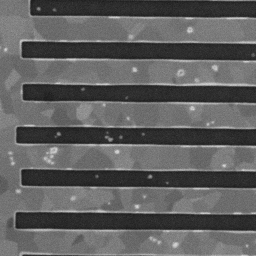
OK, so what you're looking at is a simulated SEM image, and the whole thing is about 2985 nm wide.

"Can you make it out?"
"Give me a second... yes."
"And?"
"groups of lines, slits or small figures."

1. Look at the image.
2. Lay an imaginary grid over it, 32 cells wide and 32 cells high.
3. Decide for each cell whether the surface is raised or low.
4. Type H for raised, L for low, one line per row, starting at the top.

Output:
HHHHLLLLLLLLLLLLLLLLLLLLLLLLLLLL
HHHHLLLLLLLLLLLLLLLLLLLLLLLLLLLL
HHHHHHHHHHHHHHHHHHHHHHHHHHHHHHHH
HHHHHHHHHHHHHHHHHHHHHHHHHHHHHHHH
HHHHHHHHHHHHHHHHHHHHHHHHHHHHHHHH
HHHLLLLLLLLLLLLLLLLLLLLLLLLLLLLL
HHHLLLLLLLLLLLLLLLLLLLLLLLLLLLLL
HHHHHHHHHHHHHHHLLLHHHLLLLLLLLLLL
HHHHHHHHHHHHHHHHHHHHHHHHHHHHHHHH
HHHHHHHHHHHHHHHHHHHHHHHHHHHHHHHH
HHHLLLLLLLLHHHHHHHHHHHHHHHLHHHHH
HHHLLLLLLLLLLLLLLLLLLLLLLLLLLLLL
HHHLLLLLLLLLLLLLLLLLLLLLLLLLLLLL
HHHHHHHHHHHHHHHHHHHHHHHHHHHHHHHH
HHHHHHHHHHHHHHHHHHHHHHHHHHHHHHHH
HHHHHHHHHHHHHHHHHHHHHHHHHHHHHHHH
HHLLLLLLLLLLLLLLLLLLLLLLLLLLLLLL
HHLLLLLLLLLLLLLLLLLLLLLLLLLLLLLL
HHHHHHHHHHHHHHHHHHHHHHHHHHHHHHHH
HHHHHHHHHHHHHHHHHHHHHHHHHHHHHHHH
HHHHHHHHHHHHHHHHHHHHHHHHHHHHHHHH
HHHLLLLLLLLLLLLLLLLLLLLLLLLLLLLL
HHHLLLLLLLLLLLLLLLLLLLLLLLLLLLLL
HHHHHHHHHHHHHHHLHHHHHLLLLLLLLLLL
HHHHHHHHHHHHHHHHHHHHHHHHHHHHHHHH
HHHHHHHHHHHHHHHHHHHHHHHHHHHHHHHH
HHLLLLLLLLLLLLHHHHHHHHHHHHHHHHHH
HHLLLLLLLLLLLLLLLLLLLLLLLLLLLLLL
HHLLLLLLLLLLLLLLLLLLLLLLLLLLLLLL
HHHHHHHHHHHHHHHHHHHHHHHHHHHHHHHH
HHHHHHHHHHHHHHHHHHHHHHHHHHHHHHHH
HHHHHHHHHHHHHHHHHHHHHHHHHHHHHHHH